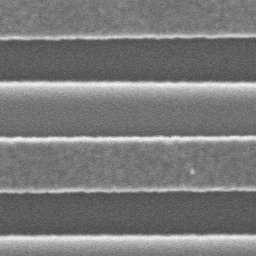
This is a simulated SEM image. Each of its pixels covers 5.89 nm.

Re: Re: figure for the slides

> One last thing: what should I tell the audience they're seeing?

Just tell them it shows lines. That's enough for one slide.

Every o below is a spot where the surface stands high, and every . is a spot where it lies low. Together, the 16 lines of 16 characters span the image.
oooooooooooooooo
oooooooooooooooo
................
................
................
oooooooooooooooo
oooooooooooooooo
oooooooooooooooo
oooooooooooooooo
oooooooooooooooo
oooooooooooooooo
oooooooooooooooo
................
................
................
oooooooooooooooo